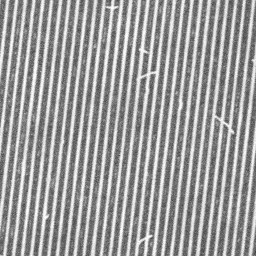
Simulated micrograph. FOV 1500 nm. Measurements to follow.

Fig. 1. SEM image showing parallel lines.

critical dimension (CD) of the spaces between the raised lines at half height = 0.0342 micrometres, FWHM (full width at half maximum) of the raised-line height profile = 14.5 nm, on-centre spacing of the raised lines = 8.72 px